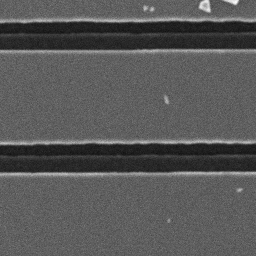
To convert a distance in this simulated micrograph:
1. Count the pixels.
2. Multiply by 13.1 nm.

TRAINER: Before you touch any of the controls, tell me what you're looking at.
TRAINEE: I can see lines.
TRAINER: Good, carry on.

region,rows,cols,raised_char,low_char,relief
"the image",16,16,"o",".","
oooooooooooooooo
................
................
oooooooooooooooo
oooooooooooooooo
oooooooooooooooo
oooooooooooooooo
oooooooooooooooo
oooooooooooooooo
................
................
oooooooooooooooo
oooooooooooooooo
oooooooooooooooo
oooooooooooooooo
oooooooooooooooo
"